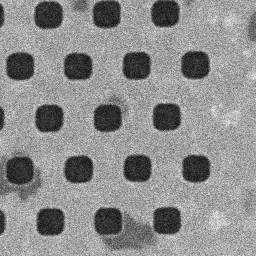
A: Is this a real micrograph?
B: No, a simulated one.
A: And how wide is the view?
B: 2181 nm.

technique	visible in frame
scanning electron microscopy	a regular array of holes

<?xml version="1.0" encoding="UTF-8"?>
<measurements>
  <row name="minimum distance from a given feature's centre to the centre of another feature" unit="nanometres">497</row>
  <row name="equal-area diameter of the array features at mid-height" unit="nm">258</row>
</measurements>